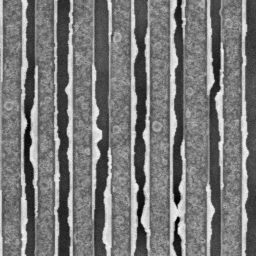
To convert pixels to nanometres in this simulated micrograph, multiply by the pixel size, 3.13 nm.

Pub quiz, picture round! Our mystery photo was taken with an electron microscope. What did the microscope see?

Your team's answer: parallel lines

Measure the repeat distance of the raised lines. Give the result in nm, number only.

116